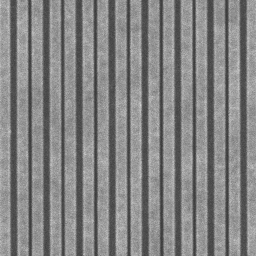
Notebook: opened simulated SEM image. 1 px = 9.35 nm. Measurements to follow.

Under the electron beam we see parallel lines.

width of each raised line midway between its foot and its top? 105 nanometers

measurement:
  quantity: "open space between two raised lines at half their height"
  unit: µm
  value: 0.0608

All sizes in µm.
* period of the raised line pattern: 0.152